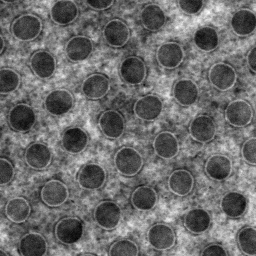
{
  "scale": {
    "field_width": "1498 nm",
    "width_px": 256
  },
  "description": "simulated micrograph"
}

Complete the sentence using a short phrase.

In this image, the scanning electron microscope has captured a regular array of raised bodies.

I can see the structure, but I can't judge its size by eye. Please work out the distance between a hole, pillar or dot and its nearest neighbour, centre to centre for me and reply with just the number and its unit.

233 nm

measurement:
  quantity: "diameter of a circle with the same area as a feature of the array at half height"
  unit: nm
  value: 154